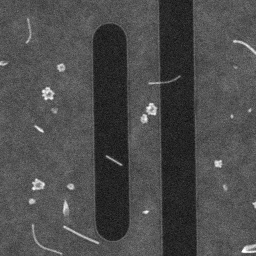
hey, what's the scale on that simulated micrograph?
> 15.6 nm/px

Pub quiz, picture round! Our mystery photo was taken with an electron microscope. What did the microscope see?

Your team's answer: groups of lines, slits or small figures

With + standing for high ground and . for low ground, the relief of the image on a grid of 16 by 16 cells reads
..........++....
..........++....
......++..++....
......++..++....
......++..++....
......++..++....
......++..++....
......++..++....
......++..++....
......++..++....
......++..++....
......++..++....
......++..++....
......++..++....
......++..++....
..........++....